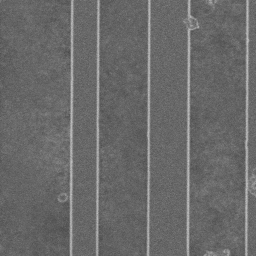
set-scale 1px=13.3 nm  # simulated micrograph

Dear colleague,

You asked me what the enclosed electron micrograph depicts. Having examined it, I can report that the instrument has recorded one or a few lines or trenches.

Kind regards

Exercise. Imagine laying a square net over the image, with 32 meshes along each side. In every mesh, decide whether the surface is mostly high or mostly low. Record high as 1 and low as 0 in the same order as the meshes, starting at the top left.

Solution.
00000000011100000001111100000001
00000000011100000001111100000001
00000000011100000001111100000001
00000000011100000001111100000001
00000000011100000001111100000001
00000000011100000001111100000001
00000000011100000001111100000001
00000000011100000001111100000001
00000000011100000001111100000001
00000000011100000001111100000001
00000000011100000001111100000001
00000000011100000001111100000001
00000000011100000001111100000001
00000000011100000001111100000001
00000000011100000001111100000001
00000000011100000001111100000001
00000000011100000001111100000001
00000000011100000001111100000001
00000000011100000001111100000001
00000000011100000001111100000001
00000000011100000001111100000001
00000000011100000001111100000001
00000000011100000001111100000001
00000000011100000001111100000001
00000000011100000001111100000001
00000000011100000001111100000001
00000000011100000001111100000001
00000000011100000001111100000001
00000000011100000001111100000001
00000000011100000001111000000001
00000000011100000001111000000001
00000000011100000001111000000001